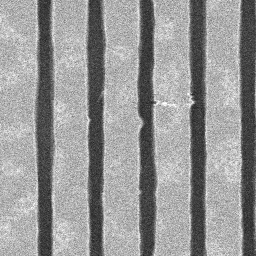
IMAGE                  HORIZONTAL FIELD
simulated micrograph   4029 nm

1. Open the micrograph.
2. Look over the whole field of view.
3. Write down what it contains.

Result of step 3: parallel lines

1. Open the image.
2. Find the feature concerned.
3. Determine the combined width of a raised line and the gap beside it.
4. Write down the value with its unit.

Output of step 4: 801 nm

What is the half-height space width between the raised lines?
224 nanometers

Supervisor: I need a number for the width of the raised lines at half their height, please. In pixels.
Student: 37